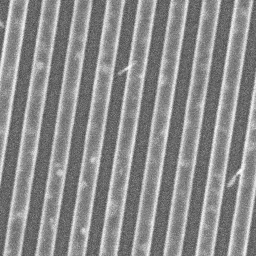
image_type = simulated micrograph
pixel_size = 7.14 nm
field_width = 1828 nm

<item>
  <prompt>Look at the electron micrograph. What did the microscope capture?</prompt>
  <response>parallel lines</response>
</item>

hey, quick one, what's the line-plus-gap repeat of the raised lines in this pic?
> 226 nm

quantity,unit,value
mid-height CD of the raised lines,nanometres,119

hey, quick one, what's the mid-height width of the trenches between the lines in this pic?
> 106 nanometers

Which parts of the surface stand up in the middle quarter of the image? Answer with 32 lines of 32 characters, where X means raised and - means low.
XXXX----XXXXX---XXXX----XXXX----
XXXX----XXXX----XXXX----XXXX----
XXXX----XXXX----XXXX----XXXX----
XXXX----XXXX----XXXX----XXXX----
XXXX----XXXX----XXXX----XXXX----
XXXX----XXXX----XXX-----XXXX----
XXX----XXXXX---XXXX----XXXXX---X
XXX----XXXX----XXXX----XXXX----X
XXX----XXXX----XXXX----XXXX----X
XXX----XXXX----XXXX----XXXX----X
XXX----XXXX----XXXX----XXXX----X
XXX----XXXX----XXXX----XXXX----X
XX-----XXXX----XXXX----XXXX---XX
XX----XXXXX---XXXX----XXXX----XX
XX----XXXX----XXXX----XXXX----XX
XX----XXXX----XXXX----XXXX----XX
XX----XXXX----XXXX----XXXX----XX
XX----XXXX----XXXX----XXXX----XX
XX----XXXX----XXXX----XXXX----XX
X----XXXXX---XXXXX---XXXXX---XXX
X----XXXX----XXXX----XXXX----XXX
X----XXXX----XXXX----XXXX----XXX
X----XXXX----XXXX----XXXX----XXX
X----XXXX----XXXX----XXXX----XXX
X----XXXX----XXXX----XXXX----XXX
X----XXXX----XXX----XXXXX---XXXX
----XXXX----XXXX----XXXX----XXXX
----XXXX----XXXX----XXXX----XXXX
----XXXX----XXXX----XXXX----XXXX
----XXXX----XXXX----XXXX----XXXX
----XXXX----XXXX----XXXX----XXXX
----XXXX----XXXX----XXXX----XXXX